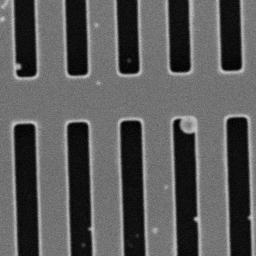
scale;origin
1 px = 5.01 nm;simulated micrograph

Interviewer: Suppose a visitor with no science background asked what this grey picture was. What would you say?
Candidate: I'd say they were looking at groups of lines, slits or small figures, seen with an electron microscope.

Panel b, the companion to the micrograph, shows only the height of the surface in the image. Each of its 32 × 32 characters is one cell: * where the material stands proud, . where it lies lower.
**..****...***...****...***...**
**...***...***...****...***...**
**...***...***...****...***...**
**...***...***...****...***...**
**...***...****..****...***...**
**...***...****..****...***...**
**...***...****...***...***...**
**...***...****...***...***...**
**...***...****...***...****..**
**..*****..*********************
********************************
********************************
********************************
********************************
*****************************.**
**..****...****...****.*****...*
**...***...****...***...****...*
**...***...****...****...***...*
**...***...****...****...***...*
**...***...****...****...***...*
**...***...****...****...***...*
**...***...****...****...***...*
**...***...****...****...***...*
**...***...****...****...***...*
**...***....***...****...***...*
**...***....***...****...***....
**...***....***...****...***....
**...****...***...****...****...
**...****...***...****...****...
**...****...***...****...****...
**...****...***...****...****...
**...****...***...****...****...